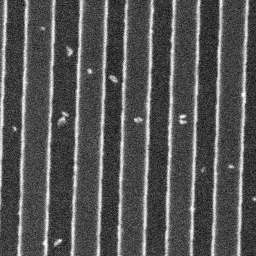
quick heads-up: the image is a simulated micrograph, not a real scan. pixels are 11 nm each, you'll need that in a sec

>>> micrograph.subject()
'lines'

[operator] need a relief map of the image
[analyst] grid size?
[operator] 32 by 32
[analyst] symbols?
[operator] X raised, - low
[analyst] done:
X--XXXX---XXX---XXX---XXX---XXX-
X--XXXX---XXX---XXX---XXX---XXX-
X--XXXX---XXX---XXX---XXX---XXX-
X--XXXX---XXX---XXX---XXX---XXX-
X--XXXX---XXX---XXX---XXX--XXXX-
X--XXXX---XXX---XXX---XXX--XXXX-
X--XXXX---XXX---XXX--XXXX--XXXX-
X--XXXX---XXX---XXX--XXXX--XXXX-
---XXX----XXX---XXX--XXXX--XXXX-
---XXX----XXX---XXX--XXXX--XXXX-
---XXX----XXX---XXX--XXXX--XXXX-
---XXX----XXX--XXXX--XXXX--XXXX-
---XXX----XXX--XXXX--XXXX--XXX--
---XXX----XXX--XXXX--XXXX--XXX--
---XXX----XXX--XXXX--XXXX--XXX--
---XXX----XXX--XXXX--XXX---XXX--
---XXX----XXX--XXXX--XXX---XXX--
---XXX----XXX--XXXX--XXX---XXX--
---XXX----XXX--XXX---XXX---XXX--
---XXX---XXXX--XXX---XXX---XXX--
---XXX---XXXX--XXX---XXX---XXX--
---XXX---XXXX--XXX---XXX---XXX--
---XXX---XXXX--XXX---XXX---XXX--
---XXX---XXXX--XXX---XXX---XXX--
---XXX---XXXX--XXX---XXX---XXX--
---XXX---XXX---XXX---XXX---XXX--
---XXX---XXX---XXX---XXX---XXX--
---XXX---XXX---XXX---XXX---XXX--
---XXX---XXX---XXX---XXX---XXX--
--XXXX---XXX---XXX---XXX---XXX--
--XXXX---XXX---XXX---XXX---XXX--
--XXXX---XXX---XXX---XXX---XXX--